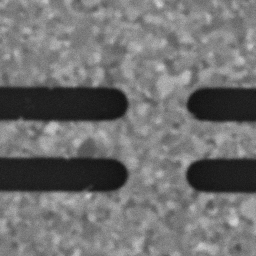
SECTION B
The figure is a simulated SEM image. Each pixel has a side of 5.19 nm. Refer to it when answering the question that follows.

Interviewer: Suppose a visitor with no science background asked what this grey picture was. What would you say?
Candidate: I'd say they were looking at groups of lines, slits or small figures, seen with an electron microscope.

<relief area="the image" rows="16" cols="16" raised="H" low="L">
HHHHHHHHHHHHHHHH
HHHHHHHHHHHHHHHH
HHHHHHHHHHHHHHHH
HHHHHHHHHHHHHHHH
HHHHHHHHHHHHHHHH
LLLLLLLHHHHHHLLL
LLLLLLLLHHHHLLLL
LLLLLLLHHHHHLLLL
HHHHHHHHHHHHHHHH
HHHHHHHHHHHHHHHH
LLLLLLLLHHHHLLLL
LLLLLLLLHHHHLLLL
HHHHHHHHHHHHHHHH
HHHHHHHHHHHHHHHH
HHHHHHHHHHHHHHHH
HHHHHHHHHHHHHHHH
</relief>